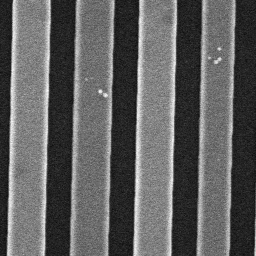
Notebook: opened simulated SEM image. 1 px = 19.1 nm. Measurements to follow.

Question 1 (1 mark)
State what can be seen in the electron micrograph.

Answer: lines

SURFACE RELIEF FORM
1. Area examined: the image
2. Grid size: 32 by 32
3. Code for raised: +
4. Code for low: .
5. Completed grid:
..++++....++++...+++++...++++...
..++++....++++...+++++...++++...
..++++...+++++...+++++...++++...
..++++...+++++...+++++...++++...
..++++...+++++...+++++...++++...
..++++...+++++...+++++...++++...
.+++++...+++++...+++++...++++...
.+++++...+++++...+++++...++++...
.+++++...+++++...+++++...++++...
.+++++...+++++...+++++...++++...
.+++++...+++++...+++++...++++...
.+++++...+++++...+++++...++++...
.+++++...+++++...+++++...++++...
.+++++...+++++...+++++...++++...
.+++++...+++++...+++++...++++...
.+++++...+++++...+++++...++++...
.+++++...+++++...+++++...++++...
.+++++...+++++...+++++...++++...
.+++++...+++++...+++++...++++...
.+++++...+++++...+++++...++++...
.+++++...+++++...+++++...++++...
.+++++...+++++...+++++...++++...
.+++++...+++++...+++++...++++...
.+++++...+++++...+++++...++++...
.+++++...+++++...++++....++++...
.+++++...+++++...++++....++++...
.+++++...+++++...++++....++++...
.+++++...+++++...++++....++++...
.+++++...+++++...++++....++++...
.+++++...+++++...++++....++++...
.+++++...++++....++++....++++...
.+++++...++++....++++....++++...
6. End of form